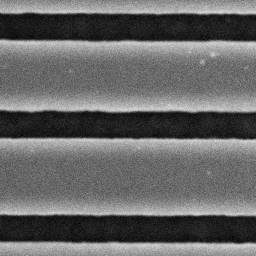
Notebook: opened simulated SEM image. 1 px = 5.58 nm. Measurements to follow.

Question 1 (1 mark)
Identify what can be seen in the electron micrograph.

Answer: lines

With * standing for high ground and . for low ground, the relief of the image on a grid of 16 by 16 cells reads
****************
................
*...............
****************
****************
****************
****************
................
................
****************
****************
****************
****************
................
................
****************